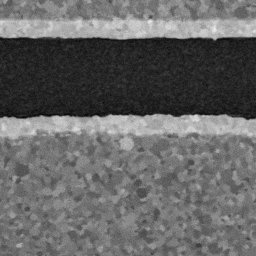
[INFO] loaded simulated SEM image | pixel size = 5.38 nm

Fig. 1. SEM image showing one or a few lines or trenches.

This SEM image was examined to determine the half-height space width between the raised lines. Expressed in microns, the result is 0.5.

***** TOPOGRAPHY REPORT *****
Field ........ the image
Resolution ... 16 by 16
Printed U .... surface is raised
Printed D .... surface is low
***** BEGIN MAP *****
UUUUUUUUUUUUUUUU
UUUUUUUUUUUUUUUU
DDDDDDDDDDDDDDDD
DDDDDDDDDDDDDDDD
DDDDDDDDDDDDDDDD
DDDDDDDDDDDDDDDD
DDDDDDDDDDDDDDDD
DDDDDDDDDDDDDDDD
UUUUUUUUUUUUUUUU
UUUUUUUUUUUUUUUU
UUUUUUUUUUUUUUUU
UUUUUUUUUUUUUUUU
UUUUUUUUUUUUUUUU
UUUUUUUUUUUUUUUU
UUUUUUUUUUUUUUUU
UUUUUUUUUUUUUUUU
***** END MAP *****